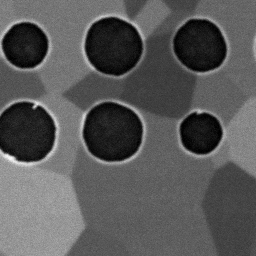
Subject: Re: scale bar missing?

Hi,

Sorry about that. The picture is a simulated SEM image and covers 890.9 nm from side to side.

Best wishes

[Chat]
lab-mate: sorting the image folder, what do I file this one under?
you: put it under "holes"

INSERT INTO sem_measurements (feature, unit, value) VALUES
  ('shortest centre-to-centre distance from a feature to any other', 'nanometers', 301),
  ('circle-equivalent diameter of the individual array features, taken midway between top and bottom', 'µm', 0.188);